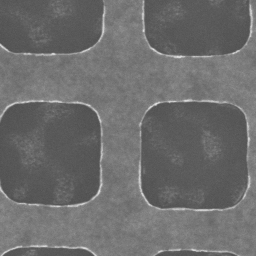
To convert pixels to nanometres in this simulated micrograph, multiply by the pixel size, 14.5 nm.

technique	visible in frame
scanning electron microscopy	holes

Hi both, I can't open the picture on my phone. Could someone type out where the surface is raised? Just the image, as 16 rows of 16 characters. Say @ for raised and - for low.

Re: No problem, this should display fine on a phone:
------@@@-------
------@@@-------
------@@@------@
@@@@@@@@@@@--@@@
@@@@@@@@@@@@@@@@
@@@@@@@@@@@@@@@@
@----@@@@@----@@
------@@@------@
------@@@------@
------@@@------@
------@@@------@
------@@@------@
@-----@@@------@
@@@@@@@@@@@@@@@@
@@@@@@@@@@@@@@@@
@---@@@@@@@@@@@@